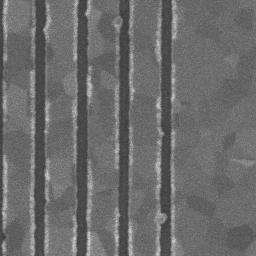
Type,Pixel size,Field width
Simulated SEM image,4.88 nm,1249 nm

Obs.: parallel lines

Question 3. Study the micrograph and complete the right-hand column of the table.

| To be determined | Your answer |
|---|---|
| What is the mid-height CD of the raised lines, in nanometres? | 150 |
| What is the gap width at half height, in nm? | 53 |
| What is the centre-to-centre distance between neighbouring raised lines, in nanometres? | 205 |